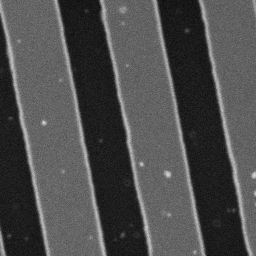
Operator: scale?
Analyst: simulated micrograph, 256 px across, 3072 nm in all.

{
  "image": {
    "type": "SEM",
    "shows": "lines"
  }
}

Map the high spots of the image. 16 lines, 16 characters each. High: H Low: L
HHHHLLHHHHLLLHHH
HHHHLLLHHHLLLHHH
HHHHLLLHHHLLLHHH
LHHHLLLHHHLLLHHH
LHHHLLLHHHHLLHHH
LHHHHLLHHHHLLLHH
LHHHHLLLHHHLLLHH
LHHHHLLLHHHLLLHH
LLHHHLLLHHHLLLHH
LLHHHLLLHHHHLLHH
LLHHHHLLHHHHLLLH
LLHHHHLLHHHHLLLH
LLHHHHLLLHHHLLLH
LLHHHHLLLHHHLLLH
LLLHHHLLLHHHHLLH
LLLHHHHLLHHHHLLH